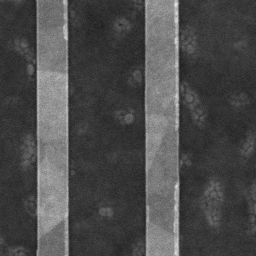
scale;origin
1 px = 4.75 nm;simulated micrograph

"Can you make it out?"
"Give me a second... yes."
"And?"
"one or a few lines or trenches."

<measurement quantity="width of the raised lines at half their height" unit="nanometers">148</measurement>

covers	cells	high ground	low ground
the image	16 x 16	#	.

..##.....##.....
..##.....##.....
..##.....##.....
..##.....##.....
..##.....##.....
..##.....##.....
..##.....##.....
..##.....##.....
..##.....##.....
..##.....##.....
..##.....##.....
..##.....##.....
..##.....##.....
..##.....##.....
..##.....##.....
..##.....##.....